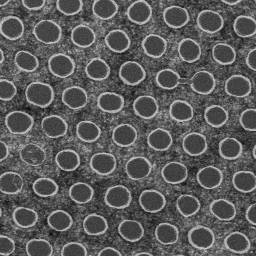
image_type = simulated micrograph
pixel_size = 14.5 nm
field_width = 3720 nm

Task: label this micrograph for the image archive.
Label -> a regular array of raised bodies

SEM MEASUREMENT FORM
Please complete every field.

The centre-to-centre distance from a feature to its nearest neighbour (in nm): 509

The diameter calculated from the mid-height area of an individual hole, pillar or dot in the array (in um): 0.323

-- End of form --